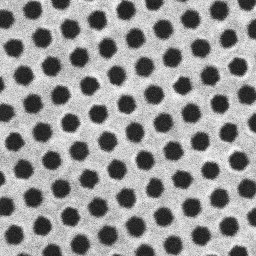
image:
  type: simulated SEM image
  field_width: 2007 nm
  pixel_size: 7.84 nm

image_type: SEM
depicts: a regular array of holes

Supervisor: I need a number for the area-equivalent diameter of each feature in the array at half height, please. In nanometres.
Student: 157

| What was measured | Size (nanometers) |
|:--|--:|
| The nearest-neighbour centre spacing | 229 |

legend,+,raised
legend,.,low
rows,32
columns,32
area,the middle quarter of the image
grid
++...+++++++..++++.....++....+++
+++++++++++....+++.....+++++++++
+++++++++++....+++....++++++++++
+++++...+++.....++++++++++++...+
++++.....++....+++++++++++++....
++++.....++++.+++++++..++++.....
.+++.....+++++++++++.....++.....
..+++..+++++++++++++.....+++...+
..++++++++++++...+++.....+++++++
.++++++++++++.....+++...++++++++
+++++++...+++.....++++++++++++..
++++++.....+++....++++++++++++..
...+++.....++++..+++++++..+++...
....++.....++++++++++++....+++..
....+++...+++++++.++++.....+++..
....++++++++++++....+++....+++++
...++++++++++++.....+++...++++++
+++++++++....+++....++++++++++++
+++++++++....+++....++++++++++++
+++..+++.....++++..+++++++..++++
++....+++....++++++++++++....+++
+.....+++...+++++++++++++.....++
+.....++++++++++++....+++.....++
++...+++++++++++++....+++....+++
++++++++++++...+++.....+++++++++
+++++++++++....+++....++++++++++
+++++..++++.....++++.+++++++..++
++++....+++....++++++++++++.....
++++.....+++...+++++++.++++.....
.+++.....++++++++++++...+++.....
..++....++++++++++++.....++....+
..++++++++++++...+++.....+++++++